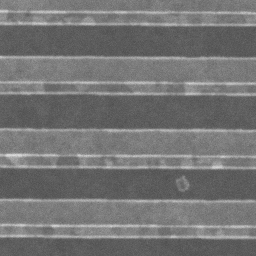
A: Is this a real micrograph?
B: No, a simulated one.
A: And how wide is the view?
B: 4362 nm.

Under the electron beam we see lines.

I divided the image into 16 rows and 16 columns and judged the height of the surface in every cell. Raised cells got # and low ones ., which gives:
################
.....###########
................
................
################
################
................
................
################
################
...............#
................
##..............
################
################
................